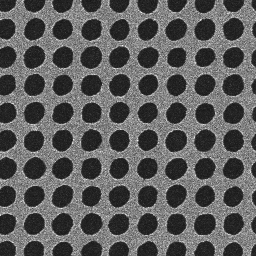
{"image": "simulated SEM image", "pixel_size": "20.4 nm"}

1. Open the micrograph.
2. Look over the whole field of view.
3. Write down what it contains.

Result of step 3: a regular array of holes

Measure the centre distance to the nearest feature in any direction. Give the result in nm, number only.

562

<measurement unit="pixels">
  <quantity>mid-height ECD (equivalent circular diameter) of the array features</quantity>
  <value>21.2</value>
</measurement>